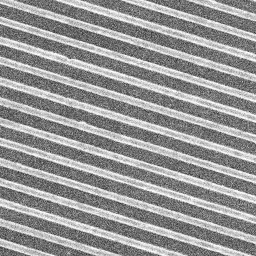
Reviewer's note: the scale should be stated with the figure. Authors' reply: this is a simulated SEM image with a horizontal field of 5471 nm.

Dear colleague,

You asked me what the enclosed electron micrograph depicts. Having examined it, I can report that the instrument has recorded parallel lines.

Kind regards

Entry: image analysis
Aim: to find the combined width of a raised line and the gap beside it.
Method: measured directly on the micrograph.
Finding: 413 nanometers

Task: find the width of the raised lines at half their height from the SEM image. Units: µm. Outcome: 0.115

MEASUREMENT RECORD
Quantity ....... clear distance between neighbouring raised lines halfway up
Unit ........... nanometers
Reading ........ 291